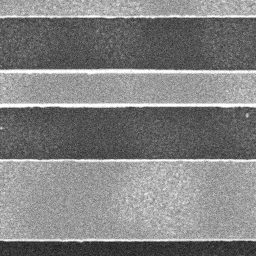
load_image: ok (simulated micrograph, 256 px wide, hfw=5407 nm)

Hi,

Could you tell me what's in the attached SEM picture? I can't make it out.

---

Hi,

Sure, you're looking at lines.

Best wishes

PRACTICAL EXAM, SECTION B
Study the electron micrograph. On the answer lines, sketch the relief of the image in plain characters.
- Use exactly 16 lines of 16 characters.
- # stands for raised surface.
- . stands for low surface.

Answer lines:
################
................
................
................
................
################
################
................
................
................
################
################
################
################
################
................